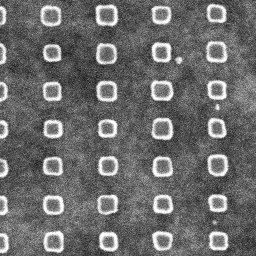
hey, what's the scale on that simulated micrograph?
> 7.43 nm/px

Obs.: a regular array of raised bodies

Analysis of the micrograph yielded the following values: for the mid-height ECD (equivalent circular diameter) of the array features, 18.7 pixels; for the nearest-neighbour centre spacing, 276 nanometers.